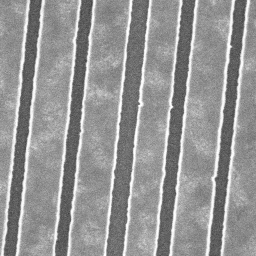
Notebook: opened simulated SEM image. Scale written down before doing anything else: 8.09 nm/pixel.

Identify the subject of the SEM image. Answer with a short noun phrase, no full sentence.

parallel lines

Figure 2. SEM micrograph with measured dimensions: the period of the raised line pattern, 412 nanometres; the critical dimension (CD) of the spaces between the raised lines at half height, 110 nm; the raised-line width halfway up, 36.8 pixels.